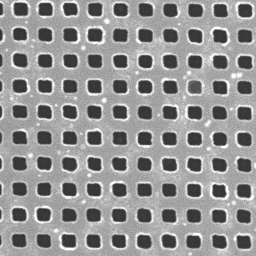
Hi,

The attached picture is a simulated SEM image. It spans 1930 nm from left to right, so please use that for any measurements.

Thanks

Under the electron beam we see a regular array of holes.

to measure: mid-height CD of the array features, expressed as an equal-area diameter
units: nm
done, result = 114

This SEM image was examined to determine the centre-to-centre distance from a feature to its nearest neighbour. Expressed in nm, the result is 186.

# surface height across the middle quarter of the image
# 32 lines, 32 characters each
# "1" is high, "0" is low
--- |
00011100011110001110001110001110
11111111111111111111111111111111
11111111111111111111111111111111
11111111111111111111111111111111
00011100011100011110001110001110
00001100011100001100001110001110
00011100001100001100001110000110
11111111111110011110011111001111
11111111111111111111111111111111
11111111111111111111111111111111
00111100011100011110011110111110
00011100001100001100001110001110
00011100001100001100001110001110
00011100011100001110001110001110
11111111111111111111111111111111
11111111111111111111111111111111
11111111111111111111111111111111
00011100011100001110001110001110
00011100001100001100001110001110
00011100001100001100001110001110
11111111111111111111111111011111
11111111111111111111111111111111
11111111111111111111111111111111
00011100111100011110011110011110
00011100011100001100001110001110
00011100011100001100001110001110
00011110011110001110001110001111
11111111111111111111111111111111
11111111111111111111111111111111
11111111111111111111111111111111
00011100011100001100001110001110
00011100011100001100001100001110